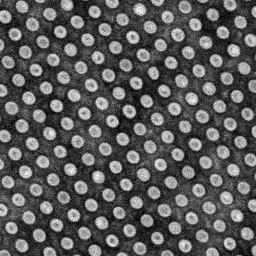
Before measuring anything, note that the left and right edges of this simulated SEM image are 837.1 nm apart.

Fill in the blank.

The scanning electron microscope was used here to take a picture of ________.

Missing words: a regular array of raised bodies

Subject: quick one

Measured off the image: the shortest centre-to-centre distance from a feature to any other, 20 px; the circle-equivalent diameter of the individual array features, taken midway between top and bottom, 39.6 nm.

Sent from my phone